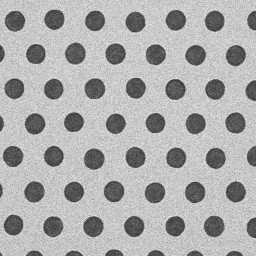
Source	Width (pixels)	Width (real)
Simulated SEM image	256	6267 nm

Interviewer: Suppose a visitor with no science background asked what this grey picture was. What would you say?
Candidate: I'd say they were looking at a regular array of holes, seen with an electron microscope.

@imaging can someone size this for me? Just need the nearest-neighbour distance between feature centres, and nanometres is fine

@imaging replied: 954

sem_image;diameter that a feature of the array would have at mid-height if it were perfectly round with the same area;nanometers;509